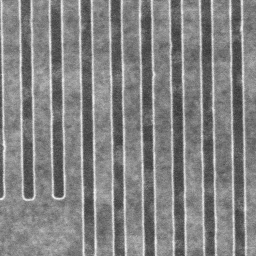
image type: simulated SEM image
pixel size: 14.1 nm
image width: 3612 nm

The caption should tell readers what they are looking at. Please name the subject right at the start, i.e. parallel lines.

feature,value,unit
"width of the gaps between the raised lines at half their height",0.247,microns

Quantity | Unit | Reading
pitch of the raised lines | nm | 424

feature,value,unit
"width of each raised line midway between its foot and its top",176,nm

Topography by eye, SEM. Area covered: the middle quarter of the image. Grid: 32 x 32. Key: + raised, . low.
....+++.....+++....+++.....+++..
....+++.....+++....+++.....+++..
....+++.....+++....+++.....+++..
....+++.....+++....+++.....+++..
....+++.....+++....+++.....+++..
....+++.....+++....+++.....+++..
....+++.....+++....+++.....+++..
....+++.....+++....+++.....+++..
....+++.....+++....+++.....+++..
....+++.....+++....+++.....+++..
....+++.....+++....+++.....+++..
....+++.....+++....+++.....+++..
....+++.....+++....+++.....+++..
....+++.....+++....+++.....+++..
....+++.....+++....+++.....+++..
....+++.....+++....+++.....+++..
....+++.....+++....+++.....+++..
....+++.....+++....+++.....+++..
....+++.....+++....+++.....+++..
.....++.....+++.....++.....+++..
.....++.....+++.....++.....+++..
.....++.....+++.....++.....+++..
.....++.....+++.....++.....+++..
.....++.....+++.....++.....+++..
.....++.....+++.....++.....+++..
.....++.....+++.....+++....+++..
.....+++....+++.....+++....+++..
.....+++....+++.....+++....+++..
.....+++....+++.....+++....+++..
.....+++....+++.....+++....+++..
.....+++....+++.....+++....+++..
.....+++....+++.....+++....+++..